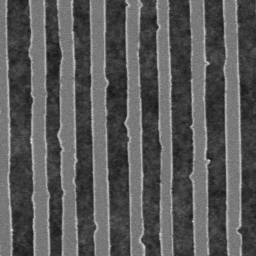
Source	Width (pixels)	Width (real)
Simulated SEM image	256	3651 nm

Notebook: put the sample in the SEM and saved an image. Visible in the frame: parallel lines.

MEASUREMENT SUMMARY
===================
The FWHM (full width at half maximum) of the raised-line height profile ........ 0.18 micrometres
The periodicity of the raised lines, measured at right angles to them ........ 459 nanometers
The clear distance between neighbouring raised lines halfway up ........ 290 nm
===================